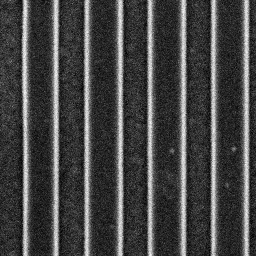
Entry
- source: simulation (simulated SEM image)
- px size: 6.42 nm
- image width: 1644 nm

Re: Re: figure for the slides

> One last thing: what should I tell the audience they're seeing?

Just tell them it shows one or a few lines or trenches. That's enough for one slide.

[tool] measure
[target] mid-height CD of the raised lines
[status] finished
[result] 0.219 microns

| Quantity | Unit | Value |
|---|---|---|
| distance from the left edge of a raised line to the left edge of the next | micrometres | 0.405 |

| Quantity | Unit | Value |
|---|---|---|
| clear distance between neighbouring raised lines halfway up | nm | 181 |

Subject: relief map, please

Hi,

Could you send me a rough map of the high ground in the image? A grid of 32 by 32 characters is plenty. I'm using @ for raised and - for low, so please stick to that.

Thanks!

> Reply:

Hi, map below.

---@@@@----@@@@----@@@@----@@@@-
---@@@@----@@@@----@@@@----@@@@-
---@@@@----@@@@----@@@@----@@@@-
---@@@@----@@@@----@@@@----@@@@-
---@@@@----@@@@----@@@@----@@@@-
---@@@@----@@@@----@@@@----@@@@-
---@@@@----@@@@----@@@@----@@@@-
---@@@@----@@@@----@@@@----@@@@-
---@@@@----@@@@----@@@@----@@@@-
---@@@@----@@@@----@@@@----@@@@-
---@@@@----@@@@----@@@@----@@@@-
---@@@@----@@@@----@@@@----@@@@-
---@@@@----@@@@----@@@@----@@@@-
---@@@@----@@@@----@@@@----@@@@-
---@@@@----@@@@----@@@@----@@@@-
---@@@@----@@@@----@@@@----@@@@-
---@@@@----@@@@----@@@@----@@@@-
---@@@@----@@@@----@@@@----@@@@-
---@@@@----@@@@----@@@@----@@@@-
---@@@@----@@@@----@@@@----@@@@-
---@@@@----@@@@----@@@@----@@@@-
---@@@@----@@@@----@@@@----@@@@-
---@@@@----@@@@----@@@@----@@@@-
---@@@@----@@@@----@@@@----@@@@-
---@@@@----@@@@----@@@@----@@@@-
---@@@@----@@@@----@@@@----@@@@-
---@@@@----@@@@----@@@@----@@@@-
---@@@@----@@@@----@@@@----@@@@-
---@@@@----@@@@----@@@@----@@@@-
---@@@@----@@@@----@@@@----@@@@-
---@@@@----@@@@----@@@@----@@@@-
---@@@@----@@@@----@@@@----@@@@-